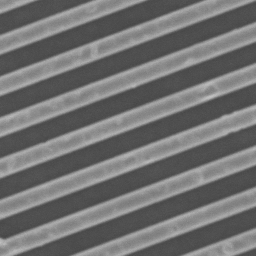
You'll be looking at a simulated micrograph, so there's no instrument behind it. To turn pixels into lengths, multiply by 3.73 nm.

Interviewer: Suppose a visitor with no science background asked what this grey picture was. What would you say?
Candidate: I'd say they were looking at parallel lines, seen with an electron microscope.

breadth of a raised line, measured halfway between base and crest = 63.8 nanometres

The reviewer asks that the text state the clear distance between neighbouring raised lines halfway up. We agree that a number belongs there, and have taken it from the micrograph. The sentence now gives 80.1 nm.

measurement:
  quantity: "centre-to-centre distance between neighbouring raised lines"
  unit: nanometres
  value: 144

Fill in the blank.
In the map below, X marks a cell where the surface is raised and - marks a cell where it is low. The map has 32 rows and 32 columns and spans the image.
XXX--------XXXXXX--------XXXXXX-
--------XXXXXX--------XXXXXX----
-----XXXXXX--------XXXXXX-------
---XXXXXX--------XXXXXX-------XX
XXXXXX--------XXXXXX--------XXXX
XXX--------XXXXXX--------XXXXXX-
X-------XXXXXXX-------XXXXXX----
------XXXXXX--------XXXXXX------
---XXXXXX--------XXXXXX--------X
XXXXXX--------XXXXXX--------XXXX
XXXX-------XXXXXXX-------XXXXXX-
X--------XXXXXX--------XXXXXX---
------XXXXXX--------XXXXXX------
---XXXXXXX-------XXXXXX--------X
-XXXXXX--------XXXXXX-------XXXX
XXXX--------XXXXXX--------XXXXXX
X--------XXXXXX--------XXXXXX---
-------XXXXXX-------XXXXXX------
----XXXXXX--------XXXXXX-------X
-XXXXXX--------XXXXXX--------XXX
XXXXX-------XXXXXX--------XXXXXX
XX--------XXXXXX-------XXXXXXX--
-------XXXXXX--------XXXXXX-----
----XXXXXX--------XXXXXX--------
--XXXXXX-------XXXXXX--------XXX
XXXXX--------XXXXXX-------XXXXXX
XX--------XXXXXX--------XXXXXX--
-------XXXXXXX-------XXXXXX-----
-----XXXXXX-------XXXXXXX-------
--XXXXXX--------XXXXXX-------XXX
XXXXXX-------XXXXXX--------XXXXX
XXX-------XXXXXXX-------XXXXXX--